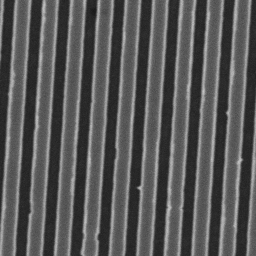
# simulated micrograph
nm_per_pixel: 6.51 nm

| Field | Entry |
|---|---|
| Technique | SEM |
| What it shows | parallel lines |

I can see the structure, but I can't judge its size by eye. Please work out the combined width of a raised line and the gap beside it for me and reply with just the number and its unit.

178 nm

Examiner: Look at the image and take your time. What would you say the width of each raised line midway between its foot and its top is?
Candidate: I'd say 0.095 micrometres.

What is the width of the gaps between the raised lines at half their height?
0.0828 um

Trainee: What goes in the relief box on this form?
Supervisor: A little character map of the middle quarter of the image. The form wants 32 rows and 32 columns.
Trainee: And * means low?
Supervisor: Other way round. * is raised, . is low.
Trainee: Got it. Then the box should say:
.***....***...****...****...****
.***....***...****...****...****
.***...****...****...****...****
.***...****...****...****...****
****...****...****...****...****
****...****...****...***....****
****...****...****...***....***.
****...****...****...***....***.
****...****...****...***...****.
****...****...***....***....***.
****...****...***....***....***.
****...****...***...****....***.
****...***....***....***...****.
****...***....***...****...****.
****...***....***...****...****.
***....***...****...****...****.
***....***...****...****...****.
***....***...****...****...****.
***...****...****...****...****.
***...****...****...****...***..
***...****...****...****...****.
***...****...****...***....****.
***...****...****...***....***..
***...****...****...***....***..
***...****...***....***....***..
***...****...***....***....***..
***...****...***....***....***..
***...***....***....***...****..
***...***....***....***...****..
***...***....***....***...****..
**....***....***...****...****..
**....***....***...****...****..